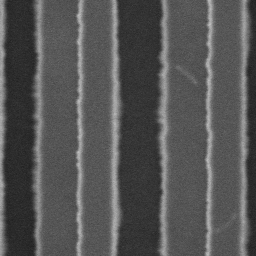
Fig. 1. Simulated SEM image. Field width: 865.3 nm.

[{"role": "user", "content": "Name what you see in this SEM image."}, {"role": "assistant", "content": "lines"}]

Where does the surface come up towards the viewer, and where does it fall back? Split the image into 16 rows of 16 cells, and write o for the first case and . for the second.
..ooooo...ooooo.
..ooooo...ooooo.
..ooooo...ooooo.
..ooooo...ooooo.
..ooooo...ooooo.
..ooooo...ooooo.
..ooooo...ooooo.
..ooooo...ooooo.
..ooooo...ooooo.
..ooooo...ooooo.
..ooooo...ooooo.
..ooooo...ooooo.
..ooooo...ooooo.
..ooooo...ooooo.
..ooooo...ooooo.
..ooooo...ooooo.